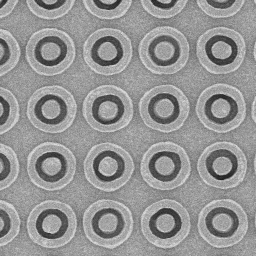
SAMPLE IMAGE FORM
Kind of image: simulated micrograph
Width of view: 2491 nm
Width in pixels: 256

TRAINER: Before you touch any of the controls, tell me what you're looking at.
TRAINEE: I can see a regular array of ring-shaped raised bodies with a dot in the middle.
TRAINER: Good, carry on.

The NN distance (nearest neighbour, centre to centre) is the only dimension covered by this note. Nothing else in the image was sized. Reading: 546 nm